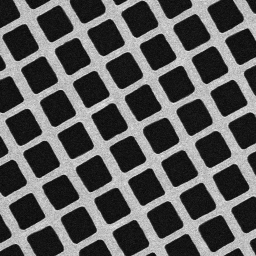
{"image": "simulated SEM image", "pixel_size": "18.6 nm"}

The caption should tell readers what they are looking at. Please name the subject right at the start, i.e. a regular array of holes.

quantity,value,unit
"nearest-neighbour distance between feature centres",691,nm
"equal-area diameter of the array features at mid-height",611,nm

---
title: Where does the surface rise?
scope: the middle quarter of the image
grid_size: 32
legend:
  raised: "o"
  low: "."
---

......oooo.........oo....ooooooo
....ooooooo........ooo.oooo...oo
o.oooo...oo.........ooooo......o
oooo.....ooo.......ooooo.......o
oo........ooo.....oooooo........
oo........ooo...oooo.ooo........
ooo........ooooooo....ooo.......
ooo........ooooo.......oo.......
.ooo.......oooo........ooo....oo
..ooo....oooooo.........ooo.oooo
..ooo..oooo..ooo........ooooo...
...oooooo.....ooo.......oooo....
...oooo.......ooo......ooooo....
..ooooo........ooo...oooooooo...
ooooooo........oooooooo....oo...
oo...ooo........ooooo......ooo..
......oo........oooo........oo..
......ooo.....oooooo........ooo.
.......ooo..ooo...oo.........ooo
.......oooooo.....ooo........ooo
........oooo.......ooo......oooo
.......oooo........ooo....oooooo
o....ooooooo........ooo.ooo....o
o..oooo..ooo........oooooo.....o
ooooo.....ooo.......ooooo.......
oooo.......ooo.....ooooo........
ooo........ooo...ooo..ooo.......
ooo.........ooooooo....oo.......
.ooo........ooooo......ooo......
..ooo.......oooo........ooo....o
..ooo.....oooooo........ooo..ooo
...ooo..oooo..ooo........oooooo.